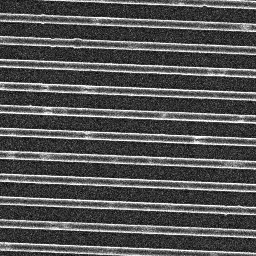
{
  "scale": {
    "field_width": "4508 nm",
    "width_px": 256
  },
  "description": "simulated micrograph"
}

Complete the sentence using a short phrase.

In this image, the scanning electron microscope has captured parallel lines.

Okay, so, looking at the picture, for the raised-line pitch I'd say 0.403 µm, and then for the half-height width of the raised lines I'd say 134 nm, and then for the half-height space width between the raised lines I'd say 0.268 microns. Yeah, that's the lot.